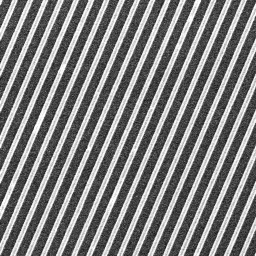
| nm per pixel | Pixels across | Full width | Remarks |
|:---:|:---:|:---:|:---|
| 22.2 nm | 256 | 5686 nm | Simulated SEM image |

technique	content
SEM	parallel lines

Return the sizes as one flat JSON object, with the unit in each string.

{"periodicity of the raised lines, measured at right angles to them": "0.312 um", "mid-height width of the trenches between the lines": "230 nm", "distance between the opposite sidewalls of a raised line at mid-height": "94.5 nm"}